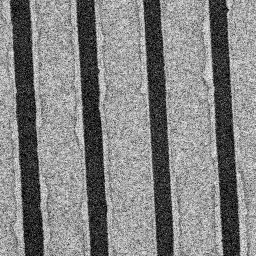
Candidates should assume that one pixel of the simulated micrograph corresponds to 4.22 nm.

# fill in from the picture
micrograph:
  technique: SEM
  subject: one or a few lines or trenches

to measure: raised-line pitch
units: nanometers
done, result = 277